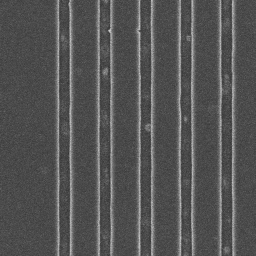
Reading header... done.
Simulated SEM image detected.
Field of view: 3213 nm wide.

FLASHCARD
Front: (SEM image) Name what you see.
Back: parallel lines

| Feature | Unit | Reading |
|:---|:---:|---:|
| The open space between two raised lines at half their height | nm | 141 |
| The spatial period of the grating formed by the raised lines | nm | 509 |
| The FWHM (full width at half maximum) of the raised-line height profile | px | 29.5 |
